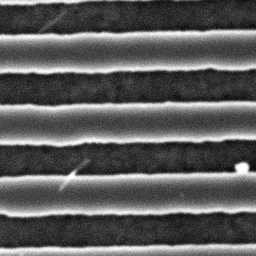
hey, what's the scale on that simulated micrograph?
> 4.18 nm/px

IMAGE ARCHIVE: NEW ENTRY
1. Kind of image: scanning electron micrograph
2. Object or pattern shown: lines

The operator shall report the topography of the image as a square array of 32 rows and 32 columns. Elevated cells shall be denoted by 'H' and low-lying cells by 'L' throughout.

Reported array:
LLLLLLLLLLLLLLLLLLLLLLLLLLLLLLLL
LLLLLLLLLLLLLLLLLLLLLLLLLLLLLLLL
LLLLLLLLLLLLLLLLLLLLLLLLLLLLLLLL
LLLLLLLLLLLLLLLLLLLLLLLLLLLLLLLL
LLLHLHHLHHHHHHHHHHHHHHHHHHHHHHHH
HHHHHHHHHHHHHHHHHHHHHHHHHHHHHHHH
HHHHHHHHHHHHHHHHHHHHHHHHHHHHHHHH
HHHHHHHHHHHHHHHHHHHHHHHHHHHHHHHH
HHHHHHHHHHHHHHHHHHHHHHHHHHLHHHHH
LLLLLLLLLLLLLLLLLLLLLLLLLLLLLLLL
LLLLLLLLLLLLLLLLLLLLLLLLLLLLLLLL
LLLLLLLLLLLLLLLLLLLLLLLLLLLLLLLL
LLLLLLLLLLLLLLLLLLLLLLLLLLLLLLLL
HHHHHHHHHHHHHHHHHHHHHHHHHHHHHHHH
HHHHHHHHHHHHHHHHHHHHHHHHHHHHHHHH
HHHHHHHHHHHHHHHHHHHHHHHHHHHHHHHH
HHHHHHHHHHHHHHHHHHHHHHHHHHHHHHHH
HHHHHHHHHHHHHHHHHHHHHHHHHHHLLLLL
LLLLLLLLLLLLLLLLLLLLLLLLLLLLLLLL
LLLLLLLLLLLLLLLLLLLLLLLLLLLLLLLL
LLLLLLLLLLLLLLLLLLLLLLLLLLLLLLHL
LLLLLLLLLLLLLLLLLLLLLLLLLLLLLHHL
HHHHHHHHHHHHHHHHHHHHHHHHHHHHHHHH
HHHHHHHHHHHHHHHHHHHHHHHHHHHHHHHH
HHHHHHHHHHHHHHHHHHHHHHHHHHHHHHHH
HHHHHHHHHHHHHHHHHHHHHHHHHHHHHHHH
HHHHHHHHHHHHHHHHHHHHHHLHHHLLHHLL
LLLLLLLLLLLLLLLLLLLLLLLLLLLLLLLL
LLLLLLLLLLLLLLLLLLLLLLLLLLLLLLLL
LLLLLLLLLLLLLLLLLLLLLLLLLLLLLLLL
LLLLLLLLLLLLLLLLLLLLLLLLLLLLLLLL
HHHHHHHHHHHHHHHHHHHHHHHHHHHHHHHH